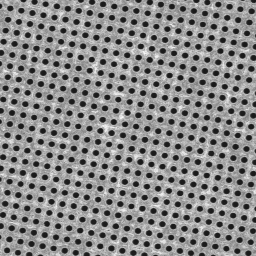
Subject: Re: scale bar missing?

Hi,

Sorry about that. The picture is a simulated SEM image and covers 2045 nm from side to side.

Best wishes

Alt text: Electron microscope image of a regular array of holes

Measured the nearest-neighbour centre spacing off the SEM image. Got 88.6 nanometres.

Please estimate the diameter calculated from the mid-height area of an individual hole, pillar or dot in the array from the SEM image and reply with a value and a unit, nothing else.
46.9 nm